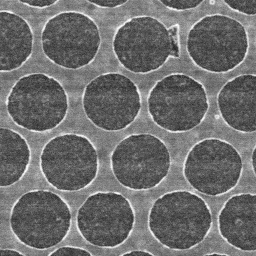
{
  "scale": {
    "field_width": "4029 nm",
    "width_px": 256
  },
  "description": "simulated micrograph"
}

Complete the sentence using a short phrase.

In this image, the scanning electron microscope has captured a regular array of holes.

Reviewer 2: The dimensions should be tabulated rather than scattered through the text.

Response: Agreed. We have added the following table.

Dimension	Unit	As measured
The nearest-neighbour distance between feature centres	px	66.4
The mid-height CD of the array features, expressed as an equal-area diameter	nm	909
